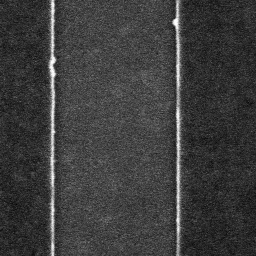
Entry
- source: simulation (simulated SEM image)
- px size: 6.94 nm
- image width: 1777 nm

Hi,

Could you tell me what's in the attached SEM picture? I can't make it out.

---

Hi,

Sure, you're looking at one or a few lines or trenches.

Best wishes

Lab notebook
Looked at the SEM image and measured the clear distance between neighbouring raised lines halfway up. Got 858 nanometres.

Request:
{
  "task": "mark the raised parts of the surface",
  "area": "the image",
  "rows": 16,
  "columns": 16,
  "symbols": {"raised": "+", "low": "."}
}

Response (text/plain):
+++........+++++
+++........+++++
+++........+++++
+++........+++++
+++........+++++
+++........+++++
+++........+++++
+++........+++++
+++........+++++
+++........+++++
+++........+++++
+++........+++++
+++........+++++
+++........+++++
+++........+++++
+++........+++++